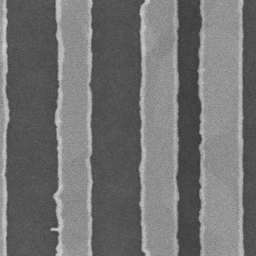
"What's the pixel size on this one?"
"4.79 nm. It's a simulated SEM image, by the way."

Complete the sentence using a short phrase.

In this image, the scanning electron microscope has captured one or a few lines or trenches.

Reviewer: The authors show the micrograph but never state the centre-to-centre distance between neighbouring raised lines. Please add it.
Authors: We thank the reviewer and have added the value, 352 nanometres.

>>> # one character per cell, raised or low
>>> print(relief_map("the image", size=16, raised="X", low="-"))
----XX---XX--XX-
----XX---XX--XX-
----XX---XX--XX-
----XX---XX--XX-
----XX---XX-XXX-
----XX---XX-XXX-
----XX---XX--XX-
----XX---XX--XX-
----XX---XX--XX-
----XX---XX--XX-
----XX---XX--XX-
----XX---XX--XX-
----XX---XX--XX-
----XX---XX--XX-
----XX---XX--XX-
----XX---XX--XX-